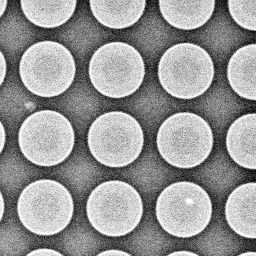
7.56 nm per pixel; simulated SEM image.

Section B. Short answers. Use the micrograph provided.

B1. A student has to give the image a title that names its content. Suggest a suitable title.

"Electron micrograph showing an array of small figures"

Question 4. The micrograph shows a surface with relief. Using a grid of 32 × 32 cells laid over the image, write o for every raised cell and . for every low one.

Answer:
o..oooooo..ooooooo..ooooooo..ooo
...oooooo...oooooo..oooooo...ooo
....oooo....ooooo....ooooo...ooo
.......................o.......o
................................
.....oo.......oo................
...oooooo...ooooo....ooooo....oo
o..oooooo..ooooooo..oooooo...ooo
o..oooooo..ooooooo..ooooooo..ooo
...oooooo..ooooooo..ooooooo..ooo
...oooooo...ooooo...oooooo...ooo
....oooo.....oooo....oooo.....oo
................................
................................
....oooo.....ooo......ooo......o
...oooooo...ooooo...oooooo...ooo
o.ooooooo..ooooooo..oooooo...ooo
o.ooooooo..ooooooo..oooooo..oooo
...oooooo..ooooooo..oooooo..oooo
...ooooo....ooooo...oooooo...ooo
.....oo......ooo......ooo.....oo
................................
................................
...ooooo....ooooo....oooo.....oo
...oooooo..oooooo...oooooo...ooo
..ooooooo..ooooooo..oooooo..oooo
..ooooooo..ooooooo..oooooo..oooo
...oooooo..oooooo...oooooo..oooo
...ooooo....ooooo....oooo....ooo
......................oo......oo
................................
....ooo......oo.......o.........